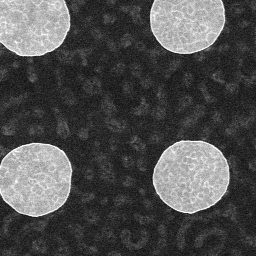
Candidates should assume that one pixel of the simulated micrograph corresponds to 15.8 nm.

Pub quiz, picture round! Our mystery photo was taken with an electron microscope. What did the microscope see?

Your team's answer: raised bodies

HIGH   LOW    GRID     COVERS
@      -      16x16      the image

@@@@------@@@@--
@@@@-----@@@@@--
@@@@------@@@---
----------------
----------------
----------------
----------------
----------------
----------------
-@@@------@@@@--
@@@@------@@@@--
@@@@------@@@@--
@@@@------@@@@--
----------------
----------------
----------------